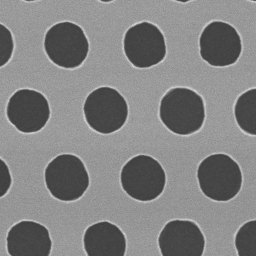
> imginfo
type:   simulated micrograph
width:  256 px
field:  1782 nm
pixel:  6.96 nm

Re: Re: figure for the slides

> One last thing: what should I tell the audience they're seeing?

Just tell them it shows a regular array of holes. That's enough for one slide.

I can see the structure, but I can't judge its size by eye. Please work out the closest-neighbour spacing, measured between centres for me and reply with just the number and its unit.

529 nm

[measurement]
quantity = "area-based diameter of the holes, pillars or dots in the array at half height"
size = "311 nm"